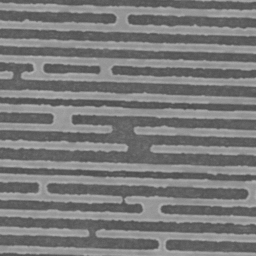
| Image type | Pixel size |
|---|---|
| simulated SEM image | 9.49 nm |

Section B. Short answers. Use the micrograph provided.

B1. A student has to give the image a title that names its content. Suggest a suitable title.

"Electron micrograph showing parallel lines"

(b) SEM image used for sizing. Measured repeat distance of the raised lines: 164 nm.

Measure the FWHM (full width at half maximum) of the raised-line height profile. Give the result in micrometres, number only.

0.0723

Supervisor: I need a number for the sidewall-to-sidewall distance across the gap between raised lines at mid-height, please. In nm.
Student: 96